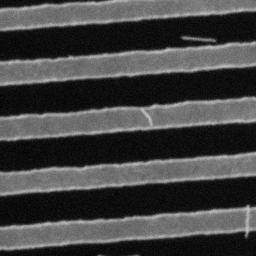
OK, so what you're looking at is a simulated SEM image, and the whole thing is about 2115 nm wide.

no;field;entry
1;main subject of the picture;lines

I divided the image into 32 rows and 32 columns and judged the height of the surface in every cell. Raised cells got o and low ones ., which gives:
........oooooooooooooooooooooooo
ooooooooooooooooooooooooooooo...
oooooooooooooooo................
oooo............................
................................
............................oooo
.................o.ooooooooooooo
.....ooooooooooooooooooooooooooo
oooooooooooooooooooooooooooo....
ooooooooooooooo.................
oo..............................
................................
.............................ooo
...............oo.oooooooooooooo
..oooooooooooooooooooooooooooooo
oooooooooooooooooooooooooo......
ooooooooooooo...................
................................
................................
............................oooo
...............ooooooooooooooooo
..oooooooooooooooooooooooooooooo
ooooooooooooooooooooooo.........
ooooooooooo.....................
................................
................................
..........................oooooo
...............ooooooooooooooooo
oooooooooooooooooooooooooooooooo
ooooooooooooooooooooooo.........
oooooooo........................
................................